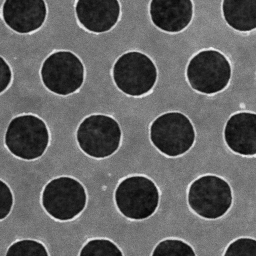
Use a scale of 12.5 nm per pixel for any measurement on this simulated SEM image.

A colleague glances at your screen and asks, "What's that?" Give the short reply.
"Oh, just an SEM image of a regular array of holes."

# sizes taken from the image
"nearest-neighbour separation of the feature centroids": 895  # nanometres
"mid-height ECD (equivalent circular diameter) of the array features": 557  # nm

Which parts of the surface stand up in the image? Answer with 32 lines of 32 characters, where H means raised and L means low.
LLLLLLHHHHLLLLLHHHHLLLLLHHHHLLLL
LLLLLLHHHLLLLLLHHHHLLLLLHHHHLLLL
LLLLLLHHHHLLLLLHHHHLLLLLHHHHLLLL
HLLLLHHHHHHLLLHHHHHHLLLHHHHHHLLL
HHHHHHHHHHHHHHHHHHHHHHHHHHHHHHHH
HHHHHHHHHHHHHHHHHHHHHHHHHHHHHHHH
HHHHHHHLLHHHHHHHLHHHHHHHHLLHHHHH
LHHHHHLLLLHHHHHLLLLHHHHHLLLLHHHH
LHHHHLLLLLLHHHLLLLLLHHHLLLLLLHHH
LLHHHLLLLLLHHHLLLLLLHHHLLLLLLHHH
LHHHHLLLLLHHHHLLLLLHHHHHLLLLHHHH
HHHHHHHLLHHHHHHLLLHHHHHHHLLHHHHH
HHHHHHHHHHHHHHHHHHHHHHHHHHHHHHHH
HHHHHHHHHHHHHHHHHHHHHHHHHHHHHHHH
HHLLHHHHHHHLLHHHHHHHLLLHHHHHHLLL
HLLLLLHHHHLLLLLHHHHLLLLLHHHHLLLL
HLLLLLHHHHLLLLLHHHHLLLLLHHHHLLLL
HLLLLLHHHHLLLLLHHHHLLLLLHHHHLLLL
HLLLLLHHHHLLLLLHHHHHLLLLHHHHHLLL
HHLLLHHHHHHLLLHHHHHHHLHHHHHHHHHH
HHHHHHHHHHHHHHHHHHHHHHHHHHHHHHHH
HHHHHHHHHHHHHHHHHHHHHHHHHHHHHHHH
HHHHHHHLLLHHHHHLLLLHHHHHLLLLHHHH
LHHHHHLLLLLHHHHLLLLLHHHHLLLLLHHH
LLHHHLLLLLLHHHLLLLLLHHHLLLLLLHHH
LLHHHLLLLLLHHHHLLLLLHHHHLLLLLHHH
LHHHHHLLLLHHHHHLLLLHHHHHLLLLHHHH
HHHHHHHLLHHHHHHHHHHHHHHHHHHHHHHH
HHHHHHHHHHHHHHHHHHHHHHHHHHHHHHHH
HHHHHHHHHHHHHHHHHHHHHHHHHHHHHHHH
HHLLLHHHHHHLLLHHHHHHLLLLHHHHHLLL
HLLLLLHHHHLLLLLHHHHLLLLLHHHHLLLL